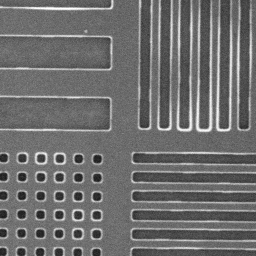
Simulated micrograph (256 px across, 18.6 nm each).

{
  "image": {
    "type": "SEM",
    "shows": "groups of lines, slits or small figures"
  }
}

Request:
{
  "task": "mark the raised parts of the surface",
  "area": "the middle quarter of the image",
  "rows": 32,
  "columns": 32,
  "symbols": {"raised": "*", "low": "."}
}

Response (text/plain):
............*******...**...**...
*******************...**...**...
*******************...**...**...
*******************...**...**...
*******************...**...**...
*******************...**...**...
*******************...**...**...
*******************...**...**...
...........********...**...**...
............*******...**...*....
............*******...**...*....
............*******...**...*....
............*******...**...*....
............*******...**...*....
............*******...**...*....
............*******...**...*....
...........**************.***..*
********************************
********************************
********************************
********************************
********************************
***.*************...............
**...**..********...............
***..**..********...............
********************************
********************************
***.****.********...............
**...**..********...............
***.****.*********..............
********************************
********************************